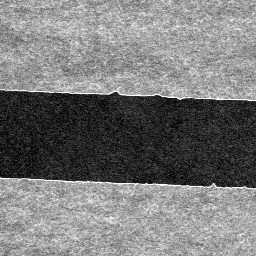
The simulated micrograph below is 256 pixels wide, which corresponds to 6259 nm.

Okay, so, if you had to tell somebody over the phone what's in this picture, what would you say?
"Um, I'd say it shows one or a few lines or trenches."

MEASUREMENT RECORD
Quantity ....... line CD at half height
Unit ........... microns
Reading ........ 2.17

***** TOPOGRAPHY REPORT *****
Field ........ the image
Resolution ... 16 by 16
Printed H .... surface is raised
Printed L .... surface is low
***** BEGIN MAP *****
LLLLLLLLLLLLLLLL
LLLLLLLLLLLLLLLL
LLLLLLLLLLLLLLLL
LLLLLLLLLLLLLLLL
LLLLLLLLLLLLLLLL
LLLLLLLLLLLLLLLL
HHHHHHHHHHHHHHHH
HHHHHHHHHHHHHHHH
HHHHHHHHHHHHHHHH
HHHHHHHHHHHHHHHH
HHHHHHHHHHHHHHHH
LLLLLLLLLHHHHHHH
LLLLLLLLLLLLLLLL
LLLLLLLLLLLLLLLL
LLLLLLLLLLLLLLLL
LLLLLLLLLLLLLLLL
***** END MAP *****